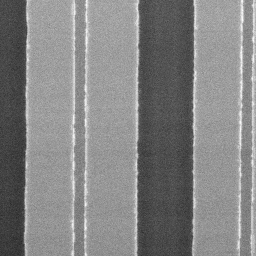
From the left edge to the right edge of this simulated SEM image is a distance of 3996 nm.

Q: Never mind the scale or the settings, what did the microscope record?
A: lines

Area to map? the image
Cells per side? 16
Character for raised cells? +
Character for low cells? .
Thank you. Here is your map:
..+++++++...++++
..+++++++...++++
..+++++++...++++
..+++++++...++++
..+++++++...++++
..+++++++...++++
..+++++++...++++
..+++++++...++++
..+++++++...++++
..+++++++...++++
..+++++++...++++
..+++++++...++++
..+++++++...++++
..+++++++...++++
..++++++....++++
..++++++....++++